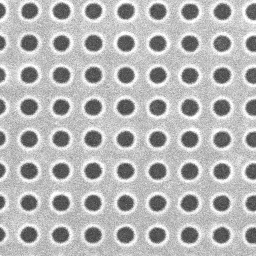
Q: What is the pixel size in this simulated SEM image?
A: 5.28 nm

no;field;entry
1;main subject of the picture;a regular array of holes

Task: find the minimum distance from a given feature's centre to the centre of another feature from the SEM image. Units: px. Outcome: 31.8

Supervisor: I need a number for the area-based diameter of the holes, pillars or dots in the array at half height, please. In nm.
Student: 97.3